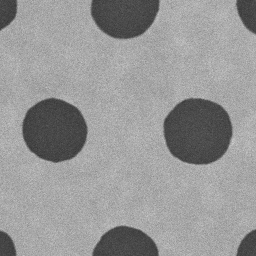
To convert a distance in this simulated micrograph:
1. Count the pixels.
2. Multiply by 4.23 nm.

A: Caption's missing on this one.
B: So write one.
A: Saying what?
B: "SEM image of holes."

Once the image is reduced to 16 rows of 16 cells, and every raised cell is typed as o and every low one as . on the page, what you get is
.ooooo....ooooo.
.ooooo...oooooo.
oooooooooooooooo
oooooooooooooooo
oooooooooooooooo
oooooooooooooooo
oo..ooooooo...oo
o....ooooo....oo
o....ooooo....oo
oo...oooooo...oo
oooooooooooooooo
oooooooooooooooo
oooooooooooooooo
oooooooooooooooo
ooooooo..ooooooo
.ooooo....ooooo.